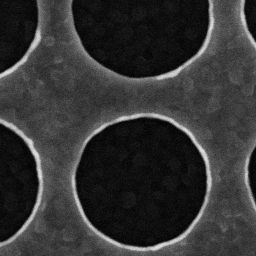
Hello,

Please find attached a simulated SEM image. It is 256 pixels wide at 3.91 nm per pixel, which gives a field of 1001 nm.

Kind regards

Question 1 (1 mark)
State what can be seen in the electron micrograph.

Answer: holes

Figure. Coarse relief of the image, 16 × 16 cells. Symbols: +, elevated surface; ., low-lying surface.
..+++........++.
..+++........++.
..+++........+++
.+++++......++++
+++++++....+++++
++++++++++++++++
++++++++++++++++
++++++++..++++++
.+++++......++++
..+++.......++++
..+++........+++
..+++........+++
..+++........+++
..+++.......++++
.+++++.....+++++
++++++++++++++++